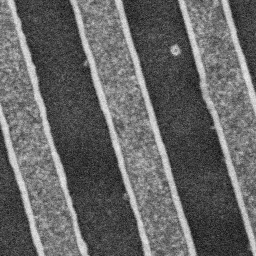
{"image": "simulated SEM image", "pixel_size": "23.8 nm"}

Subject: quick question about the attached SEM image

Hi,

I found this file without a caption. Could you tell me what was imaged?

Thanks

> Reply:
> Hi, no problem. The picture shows one or a few lines or trenches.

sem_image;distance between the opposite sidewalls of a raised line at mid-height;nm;1000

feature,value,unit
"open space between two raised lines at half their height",1.45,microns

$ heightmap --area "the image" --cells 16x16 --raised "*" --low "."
*....***...***..
*....***....**..
*....***....***.
**....**....***.
**....***....**.
**....***....***
***....**....***
***....***....**
***....***....**
.**....***....**
.***....**....**
.***....***....*
..**....***....*
..***....**....*
..***....***....
..***....***....